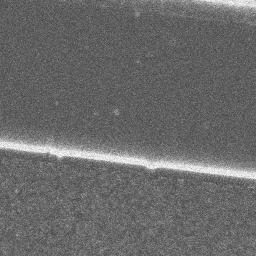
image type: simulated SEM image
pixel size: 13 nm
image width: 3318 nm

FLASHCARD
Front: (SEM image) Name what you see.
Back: one or a few lines or trenches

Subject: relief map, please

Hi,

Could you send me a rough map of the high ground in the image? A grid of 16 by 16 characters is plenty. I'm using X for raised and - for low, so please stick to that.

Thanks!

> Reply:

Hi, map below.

XXXXXXXXXXXXXXXX
XXXXXXXXXXXXXXXX
XXXXXXXXXXXXXXXX
XXXXXXXXXXXXXXXX
XXXXXXXXXXXXXXXX
XXXXXXXXXXXXXXXX
XXXXXXXXXXXXXXXX
XXXXXXXXXXXXXXXX
XXXXXXXXXXXXXXXX
----XXXXXXXXXXXX
------------XXXX
----------------
----------------
----------------
----------------
----------------